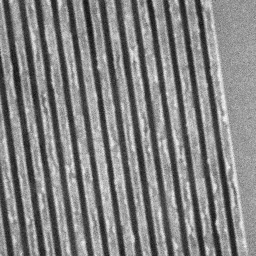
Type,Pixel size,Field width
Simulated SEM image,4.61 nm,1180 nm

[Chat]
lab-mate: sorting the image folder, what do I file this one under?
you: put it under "parallel lines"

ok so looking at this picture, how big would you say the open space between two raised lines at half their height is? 29.6 nanometers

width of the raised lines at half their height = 42.8 nm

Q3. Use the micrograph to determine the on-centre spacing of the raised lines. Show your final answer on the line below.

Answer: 73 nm